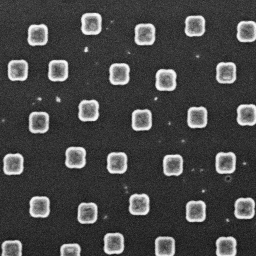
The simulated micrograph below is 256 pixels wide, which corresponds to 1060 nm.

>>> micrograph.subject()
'a regular array of raised bodies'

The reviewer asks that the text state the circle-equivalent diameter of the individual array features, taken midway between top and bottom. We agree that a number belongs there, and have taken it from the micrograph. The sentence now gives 84.5 nm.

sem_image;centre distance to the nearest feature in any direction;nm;196